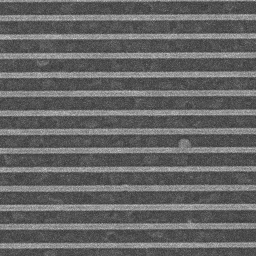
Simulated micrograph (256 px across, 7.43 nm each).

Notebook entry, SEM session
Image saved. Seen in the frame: parallel lines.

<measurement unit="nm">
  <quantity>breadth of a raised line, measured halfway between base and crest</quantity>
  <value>39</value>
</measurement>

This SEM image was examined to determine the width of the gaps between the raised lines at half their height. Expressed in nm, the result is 105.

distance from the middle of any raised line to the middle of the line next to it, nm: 141